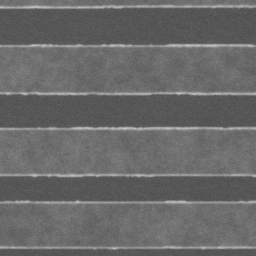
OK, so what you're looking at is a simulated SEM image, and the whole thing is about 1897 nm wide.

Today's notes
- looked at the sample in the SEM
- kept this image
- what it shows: lines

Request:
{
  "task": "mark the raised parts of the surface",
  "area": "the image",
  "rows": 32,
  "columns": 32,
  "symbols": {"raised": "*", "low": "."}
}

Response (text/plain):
********************************
................................
................................
................................
................................
................................
********************************
********************************
********************************
********************************
********************************
********************************
................................
................................
................................
................................
********************************
********************************
********************************
********************************
********************************
********************************
................................
................................
................................
********************************
********************************
********************************
********************************
********************************
********************************
................................